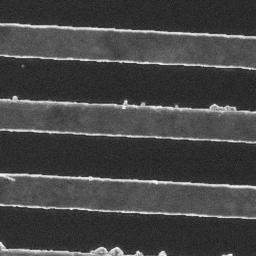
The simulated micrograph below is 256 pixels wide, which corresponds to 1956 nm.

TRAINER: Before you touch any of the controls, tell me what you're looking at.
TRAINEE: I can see lines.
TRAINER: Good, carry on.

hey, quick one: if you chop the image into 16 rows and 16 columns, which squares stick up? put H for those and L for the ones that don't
LLLLLLLLLLLLLLLL
HLLLLLLLLLLLLLLL
HHHHHHHHHHHHHHHH
HHHHHHHHHHHHHHHH
LLLLLLLLLLLLLLLL
LLLLLLLLLLLLLLLL
HHHHHHLLLLLLLLLL
HHHHHHHHHHHHHHHH
LLLLLLLLHHHHHHHH
LLLLLLLLLLLLLLLL
LLLLLLLLLLLLLLLL
HHHHHHHHHHHHHLLL
HHHHHHHHHHHHHHHH
LLLLLLLLLLLLHHHH
LLLLLLLLLLLLLLLL
LLLLLLLLLLLLLLLL